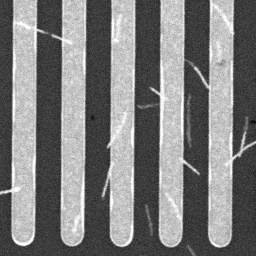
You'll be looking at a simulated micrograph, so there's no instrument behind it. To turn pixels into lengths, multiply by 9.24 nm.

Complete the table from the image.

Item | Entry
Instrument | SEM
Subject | groups of lines, slits or small figures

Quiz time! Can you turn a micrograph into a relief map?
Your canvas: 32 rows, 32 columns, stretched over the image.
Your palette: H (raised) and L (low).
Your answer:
LLHHLLLLHHHLLLHHHLLLHHHLLLHHHLLL
LLHHLLLLHHHLLLHHHLLLHHHLLLHHHLLL
LLHHLLLLHHHLLLHHHLLLHHHLLLHHHLLL
LLHHHLLLHHHLLLHHHLLLHHHLLLHHHLLL
LLHHLLLLHHHLLLHHHLLLHHHLLLHHHLLL
LLHHLLLLHHHLLLHHHLLLHHHLLLHHHLLL
LLHHLLLLHHHLLLHHHLLLHHHLLLHHHLLL
LLHHLLLLHHHLLLHHHLLLHHHLLLHHHLLL
LLHHLLLLHHHLLLHHHLLLHHHLLLHHHLLL
LLHHLLLLHHHLLLHHHLLLHHHLLLHHHLLL
LLHHLLLLHHHLLLHHHLLLHHHLLLHHHLLL
LLHHLLLLHHHLLLHHHLLLHHHLLLHHHLLL
LLHHLLLLHHHLLLHHHLLLHHHLLLHHHLLL
LLHHLLLLHHHLLLHHHLLLHHHLLLHHHLLL
LLHHLLLLHHHLLLHHHLLLHHHLLLHHHLLL
LLHHLLLLHHHLLLHHHLLLHHHLLLHHHLLL
LLHHLLLLHHHLLLHHHLLLHHHLLLHHHLLL
LLHHLLLLHHHLLLHHHLLLHHHLLLHHHLLL
LLHHLLLLHHHLLLHHHLLLHHHLLLHHHLLL
LLHHLLLLHHHLLLHHHLLLHHHLLLHHHLLL
LLHHLLLLHHHLLLHHHLLLHHHLLLHHHLLL
LLHHLLLLHHHLLLHHHLLLHHHLLLHHHLLL
LLHHLLLLHHLLLLHHHLLLHHHLLLHHHLLL
LLHHLLLLHHLLLLHHHLLLHHHLLLHHHLLL
LLHHLLLLHHLLLLHHHLLLHHHLLLHHHLLL
LLHHLLLLHHLLLLHHHLLLHHHLLLHHHLLL
LLHHLLLLHHLLLLHHHLLLHHHLLLHHHLLL
LLHHLLLLHHLLLLHHHLLLHHHLLLHHHLLL
LLHHLLLLHHLLLLHHHLLLHHHLLLHHHLLL
LLHHLLLLHHLLLLHHLLLLHHHLLLHHHLLL
LLLLLLLLHHLLLLLHLLLLLHLLLLLHLLLL
LLLLLLLLLLLLLLLLLLLLLLLLLLLLLLLL